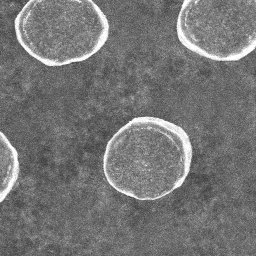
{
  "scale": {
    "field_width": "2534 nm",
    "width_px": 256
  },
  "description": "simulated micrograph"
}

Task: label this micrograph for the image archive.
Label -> raised bodies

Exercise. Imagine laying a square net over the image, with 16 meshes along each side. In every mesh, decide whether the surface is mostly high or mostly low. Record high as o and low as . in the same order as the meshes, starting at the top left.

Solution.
.ooooo.....ooooo
.oooooo....ooooo
.ooooo......oooo
..ooo........oo.
................
................
................
................
.......oooo.....
o......ooooo....
o......ooooo....
o......oooo.....
................
................
................
................